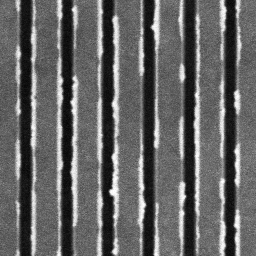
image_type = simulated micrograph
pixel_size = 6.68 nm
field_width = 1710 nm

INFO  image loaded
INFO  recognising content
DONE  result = parallel lines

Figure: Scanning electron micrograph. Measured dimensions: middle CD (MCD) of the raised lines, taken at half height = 28.9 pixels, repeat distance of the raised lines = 0.273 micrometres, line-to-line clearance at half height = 77.7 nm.